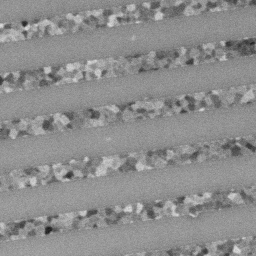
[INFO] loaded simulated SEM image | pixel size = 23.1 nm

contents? lines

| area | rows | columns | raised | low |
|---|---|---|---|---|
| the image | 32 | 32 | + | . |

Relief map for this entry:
..................++++++++++++++
...........+++++++++++++++......
....+++++++++++++++.............
++++++++++++....................
++++++..........................
..........................++++++
...................+++++++++++++
............++++++++++++++++....
.....++++++++++++++++...........
+++++++++++++++.................
++++++++........................
+.........................++++++
..................++++++++++++++
............+++++++++++++++.....
.....+++++++++++++++............
++++++++++++++..................
+++++++.........................
............................++++
.....................+++++++++++
..............+++++++++++++++...
.......+++++++++++++++..........
++++++++++++++++................
+++++++++.......................
++............................++
........................++++++++
.................+++++++++++++++
.........++++++++++++++++.......
...++++++++++++++++.............
+++++++++++.....................
++++............................
.........................+++++++
..................++++++++++++++